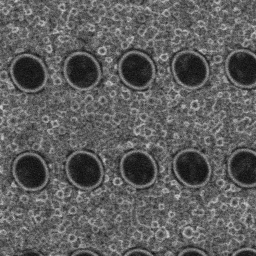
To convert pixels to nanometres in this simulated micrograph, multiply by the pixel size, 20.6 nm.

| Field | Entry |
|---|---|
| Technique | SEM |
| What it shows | a regular array of raised bodies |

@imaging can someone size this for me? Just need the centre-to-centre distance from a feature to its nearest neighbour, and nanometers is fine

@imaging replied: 1100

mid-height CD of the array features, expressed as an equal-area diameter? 752 nm